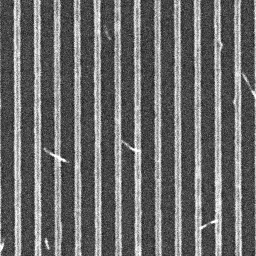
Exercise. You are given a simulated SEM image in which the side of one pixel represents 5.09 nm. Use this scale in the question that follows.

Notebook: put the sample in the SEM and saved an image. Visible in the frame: parallel lines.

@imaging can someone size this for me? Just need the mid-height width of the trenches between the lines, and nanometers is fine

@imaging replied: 74.5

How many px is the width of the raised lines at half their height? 5.38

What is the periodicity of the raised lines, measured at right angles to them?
102 nm